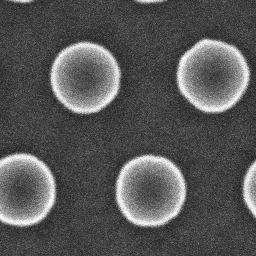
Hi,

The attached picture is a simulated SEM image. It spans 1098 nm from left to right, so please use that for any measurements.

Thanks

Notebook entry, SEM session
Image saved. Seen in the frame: raised bodies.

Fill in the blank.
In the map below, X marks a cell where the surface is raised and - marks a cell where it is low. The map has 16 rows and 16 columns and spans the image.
----------------
----------------
----------------
----XXX-----XXX-
---XXXX----XXXX-
---XXXX----XXXX-
----XXX-----XX--
----------------
----------------
----------------
XXX-----XXX-----
XXX----XXXX----X
XXX----XXXX----X
XXX-----XXX-----
----------------
----------------